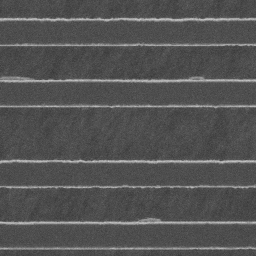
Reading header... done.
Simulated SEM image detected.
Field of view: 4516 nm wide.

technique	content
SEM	lines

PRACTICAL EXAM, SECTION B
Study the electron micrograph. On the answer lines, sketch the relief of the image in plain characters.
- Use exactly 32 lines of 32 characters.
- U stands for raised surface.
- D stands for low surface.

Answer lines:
DDDDDDDDDDDDDDDDDDDDDDDDDDDDDDDD
DDDDDDDDDDDDDDDDDDDDDDDDDDDDDDDD
UUUUUUUUUUUUUUUUUUUUUUUUUUUUUUUU
UUUUUUUUUUUUUUUUUUUUUUUUUUUUUUUU
UUUUUUUUUUUUUUUUUUUUUUUUUUUUUUUU
UUUUUUUUUUUUUUUUUUUUUUUUUUUUUUUU
DDDDDDDDDDDDDDDDDDDDDDDDDDDDDDDD
DDDDDDDDDDDDDDDDDDDDDDDDDDDDDDDD
DDDDDDDDDDDDDDDDDDDDDDDDDDDDDDDD
DDDDDDDDDDDDDDDDDDDDDDDDDDDDDDDD
UUUUUUUUUUUUUUUUUUUUUUUUUUUUUUUU
UUUUUUUUUUUUUUUUUUUUUUUUUUUUUUUU
UUUUUUUUUUUUUUUUUUUUUUUUUUUUUUUU
DDDDDDDDDDDDDDDDDDDDDDDDDDDDDDDD
DDDDDDDDDDDDDDDDDDDDDDDDDDDDDDDD
DDDDDDDDDDDDDDDDDDDDDDDDDDDDDDDD
DDDDDDDDDDDDDDDDDDDDDDDDDDDDDDDD
DDDDDDDDDDDDDDDDDDDDDDDDDDDDDDDD
DDDDDDDDDDDDDDDDDDDDDDDDDDDDDDDD
DDDDDDDDDDDDDDDDDDDDDDDDDDDDDDDD
UUUUUUUUUUUUUUUUUUUUUUUUUUUUUUUU
UUUUUUUUUUUUUUUUUUUUUUUUUUUUUUUU
UUUUUUUUUUUUUUUUUUUUUUUUUUUUUUUU
DDDDDDDDDDDDDDDDDDDDDDDDDDDDDDDD
DDDDDDDDDDDDDDDDDDDDDDDDDDDDDDDD
DDDDDDDDDDDDDDDDDDDDDDDDDDDDDDDD
DDDDDDDDDDDDDDDDDDDDDDDDDDDDDDDD
DDDDDDDDDDDDDDDDDDDDDDDDDDDDDDDD
UUUUUUUUUUUUUUUUUUUUUUUUUUUUUUUU
UUUUUUUUUUUUUUUUUUUUUUUUUUUUUUUU
UUUUUUUUUUUUUUUUUUUUUUUUUUUUUUUU
DDDDDDDDDDDDDDDDDDDDDDDDDDDDDDDD